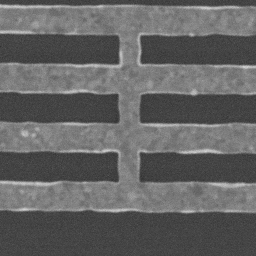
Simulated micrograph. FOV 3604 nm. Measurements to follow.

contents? groups of lines, slits or small figures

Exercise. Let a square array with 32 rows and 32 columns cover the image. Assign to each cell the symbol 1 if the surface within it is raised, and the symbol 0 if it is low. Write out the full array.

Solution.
00000000000000000000000000000000
11111111111111111111111111111111
11111111111111111111111111111111
11111111111111111111111111111111
00000000000000011100000000000000
00000000000000011000000000000000
00000000000000011000000000000000
00000000000000011000000000000000
11111111111111111111111111111111
11111111111111111111111111111111
11111111111111111111111111111111
00111111100111111111111111111111
00000000000000011000000000000000
00000000000000011000000000000000
00000000000000011000000000000000
11111111110111111100000000001110
11111111111111111111111111111111
11111111111111111111111111111111
11111111111111111111111111111111
00000000000000011000000000000000
00000000000000011000000000000000
00000000000000011000000000000000
00000000000000011000000000000000
11111111111111111111111111111111
11111111111111111111111111111111
11111111111111111111111111111111
00000000000000000011100000000011
00000000000000000000000000000000
00000000000000000000000000000000
00000000000000000000000000000000
00000000000000000000000000000000
00000000000000000000000000000000